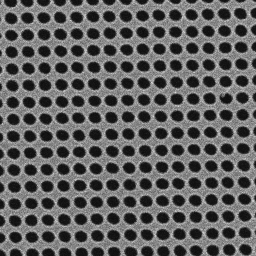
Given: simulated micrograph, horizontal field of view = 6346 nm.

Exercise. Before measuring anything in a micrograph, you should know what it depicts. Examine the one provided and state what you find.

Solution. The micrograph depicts a regular array of holes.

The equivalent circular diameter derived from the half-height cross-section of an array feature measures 313 nanometers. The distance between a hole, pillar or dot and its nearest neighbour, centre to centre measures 399 nm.